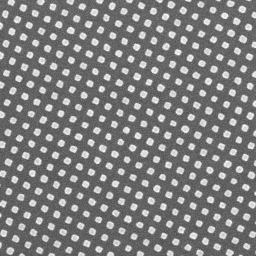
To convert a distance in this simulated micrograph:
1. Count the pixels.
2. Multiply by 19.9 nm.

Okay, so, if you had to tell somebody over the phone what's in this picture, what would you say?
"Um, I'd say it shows a regular array of raised bodies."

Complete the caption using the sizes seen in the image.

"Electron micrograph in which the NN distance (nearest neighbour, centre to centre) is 259 nanometers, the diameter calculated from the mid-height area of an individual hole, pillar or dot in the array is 119 nanometers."